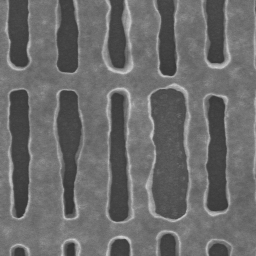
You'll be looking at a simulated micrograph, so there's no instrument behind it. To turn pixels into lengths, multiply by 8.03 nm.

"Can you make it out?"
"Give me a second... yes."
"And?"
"holes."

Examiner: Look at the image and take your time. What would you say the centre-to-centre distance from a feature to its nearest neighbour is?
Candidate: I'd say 405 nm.